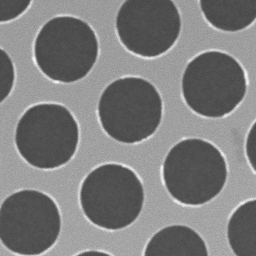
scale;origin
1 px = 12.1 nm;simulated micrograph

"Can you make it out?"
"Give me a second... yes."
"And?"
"holes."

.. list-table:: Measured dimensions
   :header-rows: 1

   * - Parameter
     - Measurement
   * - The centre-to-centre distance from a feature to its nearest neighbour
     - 1.06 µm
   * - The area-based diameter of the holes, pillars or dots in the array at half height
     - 793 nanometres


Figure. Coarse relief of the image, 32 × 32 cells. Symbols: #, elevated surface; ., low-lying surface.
....###########.......###.......
...############.......###.......
.#####....#####........###......
#####......####........####....#
#####.......###.......##########
####........###.......##########
.###........####.....#####..####
.###........############.....###
..###......############.......##
..####.....############........#
..############.....####........#
.############.......###........#
############........###.......##
####....####........####.....###
###......###........#####...####
##........###.......############
##........###......############.
##........####....#####..######.
##........############.....####.
###......############.......###.
####....#####..#####........###.
###########......###........####
###########......###........####
##########........###.......####
#.....####........####.....#####
.......###........#####..#####..
.......###........###########...
........###......############...
........#####..######...####....
.......############......###....
.......###########........###...
##....####...#####........###...